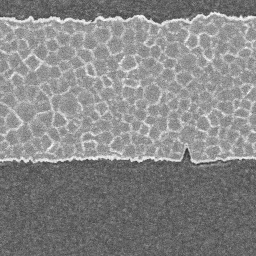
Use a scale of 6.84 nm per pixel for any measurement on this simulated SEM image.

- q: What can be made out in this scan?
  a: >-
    one or a few lines or trenches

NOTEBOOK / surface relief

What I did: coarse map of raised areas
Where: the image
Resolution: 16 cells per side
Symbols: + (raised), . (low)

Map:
................
++++++++++++++++
++++++++++++++++
++++++++++++++++
++++++++++++++++
++++++++++++++++
++++++++++++++++
++++++++++++++++
++++++++++++++++
++++++++++++++++
................
................
................
................
................
................